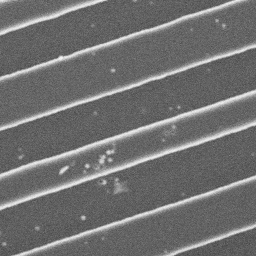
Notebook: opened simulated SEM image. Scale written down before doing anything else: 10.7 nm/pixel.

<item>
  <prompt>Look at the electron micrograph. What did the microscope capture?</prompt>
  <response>lines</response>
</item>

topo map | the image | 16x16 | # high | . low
#####........###
##........######
.......#########
....##########..
.##########.....
########........
#####........###
##.........#####
.......#######..
....#######.....
.#######........
#####.........##
##..........####
........########
.....##########.
..##########....